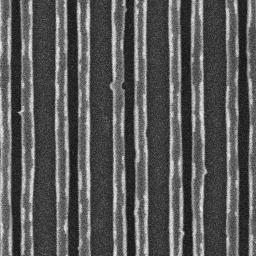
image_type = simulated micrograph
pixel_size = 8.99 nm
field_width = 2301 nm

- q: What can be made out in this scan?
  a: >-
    parallel lines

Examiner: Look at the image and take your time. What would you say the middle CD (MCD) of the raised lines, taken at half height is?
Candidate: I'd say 0.1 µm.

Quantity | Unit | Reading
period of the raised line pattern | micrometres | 0.261